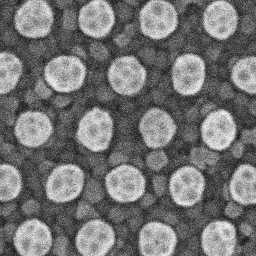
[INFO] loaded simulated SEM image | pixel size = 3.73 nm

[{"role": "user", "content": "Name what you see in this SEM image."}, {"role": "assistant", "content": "a regular array of raised bodies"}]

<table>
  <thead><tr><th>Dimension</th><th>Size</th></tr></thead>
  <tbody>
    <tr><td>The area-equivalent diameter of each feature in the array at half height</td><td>131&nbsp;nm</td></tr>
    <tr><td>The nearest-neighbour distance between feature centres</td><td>0.229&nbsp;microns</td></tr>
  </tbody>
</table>